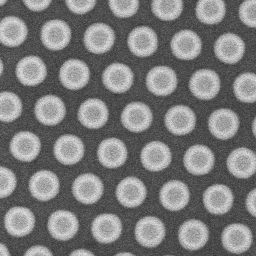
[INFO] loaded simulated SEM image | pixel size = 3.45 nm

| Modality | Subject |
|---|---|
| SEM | an array of small figures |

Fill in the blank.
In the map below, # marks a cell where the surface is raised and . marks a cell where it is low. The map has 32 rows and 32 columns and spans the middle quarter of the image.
######.....#####................
######....#######.....#####.....
######....#######....#######....
######....#######....#######....
######....#######....#######...#
#####.....#######....#######...#
...........#####.....#######....
......................####......
................................
.....#####......................
....#######.....#####.......##..
....#######....#######....######
....#######...########...#######
...########...########...#######
....#######...########...#######
.....#####.....######....#######
................####......######
...........................###..
####............................
####.....######.......##........
#####....######.....######......
#####...########...#######.....#
#####...########...########...##
####.....#######...########...##
###......######....########...##
..........####......######....##
.....................###.......#
.....##.........................
...######......###..............
..#######.....#####.......####..
..########...#######.....######.
..########...#######....#######.